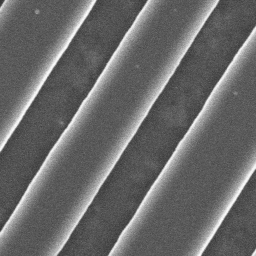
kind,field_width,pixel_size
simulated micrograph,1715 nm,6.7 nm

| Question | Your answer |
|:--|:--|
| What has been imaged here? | lines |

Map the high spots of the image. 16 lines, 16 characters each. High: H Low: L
HHHHHHLLLHHHHLLL
HHHHHLLLHHHHHLLL
HHHHLLLLHHHHLLLH
HHHHLLLHHHHLLLLH
HHHLLLHHHHHLLLHH
HHHLLLHHHHLLLHHH
HHLLLHHHHHLLLHHH
HLLLLHHHHLLLHHHH
HLLLHHHHLLLLHHHH
LLLHHHHHLLLHHHHH
LLLHHHHLLLHHHHHH
LLHHHHLLLLHHHHHL
LHHHHHLLLHHHHHHL
LHHHHLLLHHHHHHLL
HHHHHLLLHHHHHLLL
HHHHLLLHHHHHHLLL